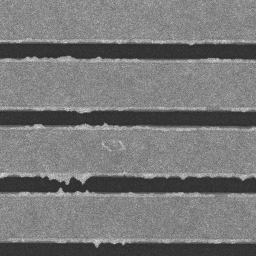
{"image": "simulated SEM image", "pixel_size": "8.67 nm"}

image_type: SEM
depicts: one or a few lines or trenches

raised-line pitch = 577 nm